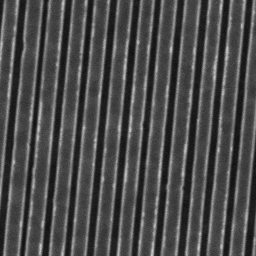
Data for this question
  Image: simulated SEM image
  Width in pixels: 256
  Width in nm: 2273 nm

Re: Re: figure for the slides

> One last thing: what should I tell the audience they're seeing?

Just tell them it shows parallel lines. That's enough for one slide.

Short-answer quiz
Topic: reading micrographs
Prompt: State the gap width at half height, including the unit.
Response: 67.3 nanometers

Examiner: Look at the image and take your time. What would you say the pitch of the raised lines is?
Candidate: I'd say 200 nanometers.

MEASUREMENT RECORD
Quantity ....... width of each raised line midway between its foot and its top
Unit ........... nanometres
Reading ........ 134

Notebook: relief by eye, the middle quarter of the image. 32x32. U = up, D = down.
DUUUDDUUUUDDUUUDDDUUUDDUUUDDDUUU
DUUUDDUUUUDDUUUDDDUUUDDUUUDDDUUU
DUUUDDUUUUDDUUUDDDUUUDDUUUDDDUUU
UUUUDDUUUDDDUUUDDDUUUDDUUUDDUUUU
UUUUDDUUUDDDUUUDDDUUUDDUUUDDUUUU
UUUUDDUUUDDDUUUDDUUUUDDUUUDDUUUU
UUUUDDUUUDDUUUUDDUUUDDDUUUDDUUUU
UUUUDDUUUDDUUUUDDUUUDDUUUUDDUUUU
UUUUDDUUUDDUUUUDDUUUDDUUUUDDUUUU
UUUDDDUUUDDUUUUDDUUUDDUUUUDDUUUU
UUUDDUUUUDDUUUDDDUUUDDUUUUDDUUUU
UUUDDUUUUDDUUUDDDUUUDDUUUDDDUUUU
UUUDDUUUUDDUUUDDDUUUDDUUUUDDUUUD
UUUDDUUUUDDUUUDDDUUUDDUUUDDDUUUD
UUUDDUUUDDDUUUDDDUUUDDUUUDDUUUUD
UUUDDUUUDDDUUUDDUUUDDDUUUDDUUUUD
UUUDDUUUDDDUUUDDUUUUDDUUUDDUUUUD
UUUDDUUUDDUUUUDDUUUDDDUUUDDUUUUD
UUUDUUUUDDUUUUDDUUUDDUUUUDDUUUUD
UUUDUUUUDDUUUUDDUUUDDUUUUDDUUUUD
UUDDUUUUDDUUUUDDUUUDDUUUUDDUUUUD
UUDDUUUUDDUUUDDDUUUDDUUUUDDUUUUD
UUDDUUUUDDUUUDDDUUUDDUUUDDDUUUUD
UUDDUUUUDDUUUDDDUUUDDUUUDDDUUUDD
UUDDUUUUDDUUUDDDUUUDDUUUDDDUUUDD
UUDDUUUDDDUUUDDDUUUDDUUUDDUUUUDD
UUDDUUUDDDUUUDDUUUUDDUUUDDUUUUDD
UUDDUUUDDDUUUDDUUUUDDUUUDDUUUUDD
UUDDUUUDDUUUUDDUUUDDDUUUDDUUUUDD
UUDUUUUDDUUUUDDUUUDDUUUUDDUUUUDD
UUDDUUUDDUUUUDDUUUDDUUUUDDUUUUDD
UDDUUUUDDUUUUDDUUUDDUUUUDDUUUUDD